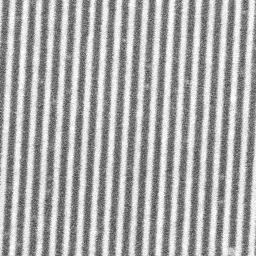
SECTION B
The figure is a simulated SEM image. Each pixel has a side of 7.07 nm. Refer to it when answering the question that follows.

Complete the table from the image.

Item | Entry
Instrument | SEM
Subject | parallel lines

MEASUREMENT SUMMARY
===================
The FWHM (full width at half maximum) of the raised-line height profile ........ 0.0291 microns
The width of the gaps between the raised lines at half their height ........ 65.3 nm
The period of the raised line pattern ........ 93.8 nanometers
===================